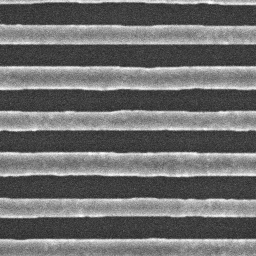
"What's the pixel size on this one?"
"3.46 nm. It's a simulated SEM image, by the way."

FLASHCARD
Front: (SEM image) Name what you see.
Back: lines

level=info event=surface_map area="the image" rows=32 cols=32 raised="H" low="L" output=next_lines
LLLLLLLLLLLLLLLLLLLLLLLLLLLLLHHH
LLLLLLLLLLLLLLLLLLLLLLLLLLLLLLLL
LLLLLLLLLLLLLLLLLLLLLLLLLLLLLLLL
HHHHHHHHHHHHHHHHHHHHHHHHHHHHHHHH
HHHHHHHHHHHHHHHHHHHHHHHHHHHHHHHH
LLLLLLLLLLLLLLLLLLLLLLLLLLLLLLLL
LLLLLLLLLLLLLLLLLLLLLLLLLLLLLLLL
LLLLLLLLLLLLLLLLLLLLLLLLLLLLLLLL
HHHHHHHHHHHHHHHHHHLLHHHHHHHHHHHH
HHHHHHHHHHHHHHHHHHHHHHHHHHHHHHHH
HHHHHHHHHHHHHHHHHHHHHHHHHHHHHHHH
LLLLLLLLLLLLLLLLLLLLLLLLLLLLLLLL
LLLLLLLLLLLLLLLLLLLLLLLLLLLLLLLL
LLLLLLLLLLLLLLLLLLLLLLLLLLLLLLLL
HHHHHHHHHHHHHHHHHHHHHHHHHHHHHHHH
HHHHHHHHHHHHHHHHHHHHHHHHHHHHHHHH
LLLLLLLLLLLLLLLLLLLLLLLLLLLLLLLL
LLLLLLLLLLLLLLLLLLLLLLLLLLLLLLLL
LLLLLLLLLLLLLLLLLLLLLLLLLLLLLLLL
HHHHHHHHHHHHHHHHHHHHHHHHHHHHHHHH
HHHHHHHHHHHHHHHHHHHHHHHHHHHHHHHH
HHHHHHHHHHHHHHHHHHHHHHHHHHHHHHHH
LLLLLLLLLLLLLLLLLLLLLLLLLLLLLLLL
LLLLLLLLLLLLLLLLLLLLLLLLLLLLLLLL
LLLLLLLLLLLLLLLLLLLLLLLLLLLLLLLL
HHHHHHHHHHHHHHHHHHHHHHHHHHHHHHHH
HHHHHHHHHHHHHHHHHHHHHHHHHHHHHHHH
LLLLLLLLLLLLLLLLLLLLLLLLLLLLLLLL
LLLLLLLLLLLLLLLLLLLLLLLLLLLLLLLL
LLLLLLLLLLLLLLLLLLLLLLLLLLLLLLLL
HHHHHHHHHHHHHHHHHHHHHHHHHHHHHHHH
HHHHHHHHHHHHHHHHHHHHHHHHHHHHHHHH